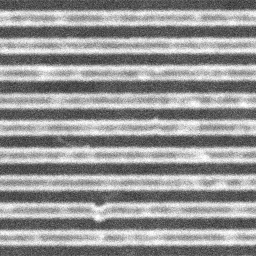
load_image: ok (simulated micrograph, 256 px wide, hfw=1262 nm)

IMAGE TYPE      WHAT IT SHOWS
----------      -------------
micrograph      parallel lines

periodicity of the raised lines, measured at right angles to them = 27.5 px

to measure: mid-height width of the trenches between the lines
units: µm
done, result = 0.0734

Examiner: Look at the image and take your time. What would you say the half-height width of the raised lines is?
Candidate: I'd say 60.4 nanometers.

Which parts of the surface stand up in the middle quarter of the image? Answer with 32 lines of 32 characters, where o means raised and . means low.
................................
oooooooooooooooooooooooooooooooo
oooooooooooooooooooooooooooooooo
oooooooooooooooooooooooooooooooo
................................
................................
................................
................................
oooooooooooooooooooooooooooooooo
oooooooooooooooooooooooooooooooo
ooooooo.ooooooooooo.oooooooooooo
................................
................................
................................
....o.oo.....oo.oo....oo......oo
oooooooooooooooooooooooooooooooo
oooooooooooooooooooooooooooooooo
................................
................................
................................
................................
oooooooooooooooooooooooooooooooo
oooooooooooooooooooooooooooooooo
oooooooooooooooooooooooooooooooo
................................
................................
................................
................................
oooooooooooooooooooooooooooooooo
oooooooooooooooooooooooooooooooo
oooooooooooooooooooooooooooooooo
................................